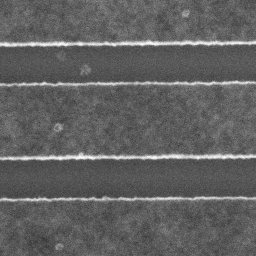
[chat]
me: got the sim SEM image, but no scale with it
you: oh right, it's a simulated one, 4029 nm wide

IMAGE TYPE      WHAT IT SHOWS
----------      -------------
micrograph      lines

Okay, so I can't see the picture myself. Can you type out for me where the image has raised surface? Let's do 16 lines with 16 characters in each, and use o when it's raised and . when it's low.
oooooooooooooooo
oooooooooooooooo
oooooooooooooooo
................
................
oooooooooooooooo
oooooooooooooooo
oooooooooooooooo
oooooooooooooooo
oooooooooooooooo
................
................
oooooooooooooooo
oooooooooooooooo
oooooooooooooooo
oooooooooooooooo